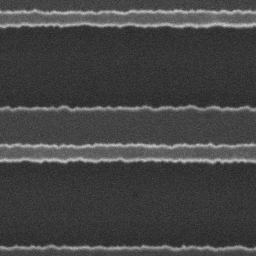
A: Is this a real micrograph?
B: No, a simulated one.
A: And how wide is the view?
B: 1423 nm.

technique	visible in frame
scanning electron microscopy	lines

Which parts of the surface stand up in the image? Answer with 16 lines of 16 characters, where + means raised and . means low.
++++++++++++++++
++++++++++++++++
................
................
................
................
................
++++++++++++++++
++++++++++++++++
++++++++++++++++
................
................
................
................
................
++++++++++++++++